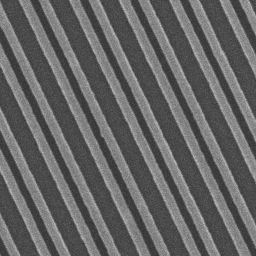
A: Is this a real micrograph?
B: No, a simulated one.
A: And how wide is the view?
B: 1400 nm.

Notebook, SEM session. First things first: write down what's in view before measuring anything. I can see parallel lines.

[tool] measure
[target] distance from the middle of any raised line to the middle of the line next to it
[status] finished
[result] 123 nanometres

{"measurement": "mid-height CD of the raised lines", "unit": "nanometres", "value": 50.7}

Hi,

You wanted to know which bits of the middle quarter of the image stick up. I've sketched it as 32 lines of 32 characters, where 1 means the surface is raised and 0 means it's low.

00110000011100111000001100011000
00110000001100011000001110011100
00111000001110011000000110001100
10011000000110011100000111001100
10001100000111001100000011001110
10001100000011001110000011100110
11001110000011000110000001100111
11000110000001100111000001110011
11100111000001100011000000110011
01100011000001110011100000110001
01110011100000110001100000111001
00110001100000111001110000011000
00111001110000011000110000011100
00011000110000011100111000001100
00011100111000001100011000001110
00001100011000001110011100000110
00001110011100000110001100000111
00000110011100000111001110000011
00000111001110000011000110000011
00000011000110000011100111000001
10000011100110000001100011000001
10000001100111000001110011000000
11000001110011000000110001100000
11000000110011100000111001100000
11100000111001100000011001110000
01100000011001110000011100110000
01110000011000110000001100111000
00110000011100111000001100011000
00111000001100011000001110011100
00011000001110011100000110001100
10011100000110001100000111001110
10001100000111001110000011000110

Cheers